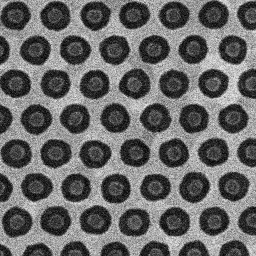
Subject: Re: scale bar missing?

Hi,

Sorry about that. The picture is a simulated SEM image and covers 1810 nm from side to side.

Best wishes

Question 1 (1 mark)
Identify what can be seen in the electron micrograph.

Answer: a regular array of ring-shaped grooves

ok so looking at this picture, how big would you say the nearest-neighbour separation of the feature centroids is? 274 nm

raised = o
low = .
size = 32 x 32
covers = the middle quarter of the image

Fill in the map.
oooooooooooo.ooooooooooooooooooo
ooooooo..oooooooo...oooooo..oooo
.oooo.....ooooo......oooo......o
.ooo.......ooo.......ooo...o...o
..oo...oo...oo..ooo...oo..ooo...
..oo..ooo..oo...ooo...oo..ooo..o
.ooo...oo...oo..ooo...oo...o...o
.ooo.......ooo.......oooo.....oo
ooooo.....oooooo....oooooo...ooo
oooooooooooooooooooooooooooooooo
.....ooooo.....oooooo....ooooo..
......oooo......oooo......ooo...
..oo..ooo...oo..ooo...oo...oo..o
.ooo...oo..ooo...oo..ooo...oo..o
.ooo...oo...oo...oo...oo...oo..o
......ooo.......oooo......ooo...
o.....oooo.....oooooo.....oooo..
oo..oooooooooooooooooooooooooooo
ooooooooooooooooo.ooooooooo..ooo
.oooo.....ooooo.....ooooo.....oo
..oo.......ooo.......ooo.......o
..oo..ooo...oo..ooo...o...ooo..o
..oo..ooo...oo...ooo..o...ooo..o
..oo...oo...oo...oo..ooo..oo...o
.oooo......oooo......ooo.......o
ooooo.....oooooo...oooooo....ooo
oooooooooooooooooooooooooooooooo
o....oooooo...ooooooo...oooooo..
......oooo......oooo......oooo..
..oo...ooo......ooo...o....oo...
..ooo..oo...oo...oo..ooo...oo..o
..ooo..oo...oo...oo..ooo...o...o